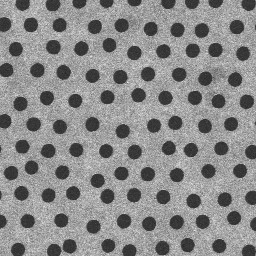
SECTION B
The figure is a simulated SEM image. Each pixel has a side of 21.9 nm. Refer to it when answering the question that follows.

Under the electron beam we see a regular array of holes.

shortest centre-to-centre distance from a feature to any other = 0.543 um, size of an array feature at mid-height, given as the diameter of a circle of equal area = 14.4 px